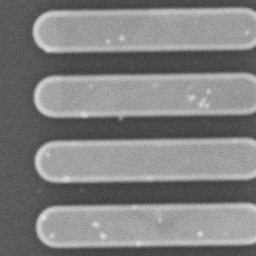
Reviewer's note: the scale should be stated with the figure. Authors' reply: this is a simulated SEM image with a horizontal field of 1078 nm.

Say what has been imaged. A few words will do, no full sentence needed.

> groups of lines, slits or small figures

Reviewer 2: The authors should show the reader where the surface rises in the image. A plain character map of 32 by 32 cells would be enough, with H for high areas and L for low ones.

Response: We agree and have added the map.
LLLLLLLLLLLLLLLLLLLLLLLLLLLLLLLL
LLLLLLLLLLLHHHHHHHHHHHHHHHHHHHHH
LLLLLHHHHHHHHHHHHHHHHHHHHHHHHHHH
LLLLHHHHHHHHHHHHHHHHHHHHHHHHHHHH
LLLLLHHHHHHHHHHHHHHHHHHHHHHHHHHH
LLLLLHHHHHHHHHHHHHHHHHHHHHHHHHHH
LLLLLLLLLLLLLLLLLLLLLLLLLLLLLLLL
LLLLLLLLLLLLLLLLLLLLLLLLLLLLLLLL
LLLLLLLLLLLLLLLLLLLLLLLLLLLLLLLL
LLLLLLLLLLLLLLLLLLLLLLLHHHHHHHHL
LLLLLHHHHHHHHHHHHHHHHHHHHHHHHHHH
LLLLLHHHHHHHHHHHHHHHHHHHHHHHHHHH
LLLLLHHHHHHHHHHHHHHHHHHHHHHHHHHH
LLLLLHHHHHHHHHHHHHHHHHHHHHHHHHHH
LLLLLLLLLLHLLLLLLLLLLLLLLLLLLLLL
LLLLLLLLLLLLLLLLLLLLLLLLLLLLLLLL
LLLLLLLLLLLLLLLLLLLLLLLLLLLLLLLL
LLLLLLLLLLLLLLLLLLLLLLLLLLLHHHHL
LLLLLHHHHHHHHHHHHHHHHHHHHHHHHHHH
LLLLLHHHHHHHHHHHHHHHHHHHHHHHHHHH
LLLLLHHHHHHHHHHHHHHHHHHHHHHHHHHH
LLLLLHHHHHHHHHHHHHHHHHHHHHHHHHHH
LLLLLLLHHLLLLLLLLLLLLLLLLLLLLLLL
LLLLLLLLLLLLLLLLLLLLLLLLLLLLLLLL
LLLLLLLLLLLLLLLLLLLLLLLLLLLLLLLL
LLLLLLLLLLLLLLLLLLLLLLLLLLLLLLLL
LLLLLLHHHHHHHHHHHHHHHHHHHHHHHHHH
LLLLLHHHHHHHHHHHHHHHHHHHHHHHHHHH
LLLLLHHHHHHHHHHHHHHHHHHHHHHHHHHH
LLLLLHHHHHHHHHHHHHHHHHHHHHHHHHHH
LLLLLLHHHHHHHHHHHHHHHLLLLLLLLLLL
LLLLLLLLLLLLLLLLLLLLLLLLLLLLLLLL